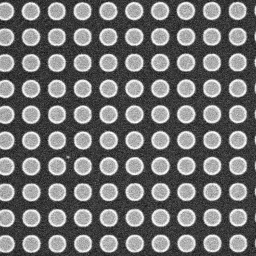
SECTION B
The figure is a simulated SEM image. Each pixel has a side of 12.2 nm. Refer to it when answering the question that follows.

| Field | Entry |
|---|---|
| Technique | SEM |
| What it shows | an array of small figures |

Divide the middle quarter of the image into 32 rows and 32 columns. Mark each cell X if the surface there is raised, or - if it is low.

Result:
---XXXX--XXXX---XXX---XXXX---XXX
----XX----XX-----XX----XX----XXX
--------------------------------
--------------------------------
---XXX----XXX---XXX----XX----XXX
---XXXX--XXXX---XXXX--XXXX--XXXX
---XXXX--XXXX---XXXX--XXXX--XXXX
---XXX---XXXX---XXX---XXXX---XXX
--------------------------------
--------------------------------
--------------------------------
---XXX---XXXX---XXX---XXXX---XXX
---XXXX--XXXX---XXXX--XXXX--XXXX
---XXXX--XXXX---XXXX--XXXX---XXX
---XXX----XX----XX-----XX-----X-
--------------------------------
--------------------------------
---XXX----XXX---XXX---XXXX---XXX
---XXXX--XXXX---XXXX--XXXX--XXXX
---XXXX--XXXX---XXXX--XXXX--XXXX
---XXX----XXX---XXX---XXXX---XXX
--------------------------------
--------------------------------
----X-----XX-----X-----XX-----X-
---XXXX--XXXX---XXXX--XXXX---XXX
---XXXX--XXXX---XXXX--XXXX--XXXX
---XXXX--XXXX---XXXX--XXXX---XXX
----X-----XX-----XX----XX-----X-
--------------------------------
--------------------------------
---XXX----XXX---XXX----XX----XXX
---XXXX--XXXX---XXXX--XXXX--XXXX